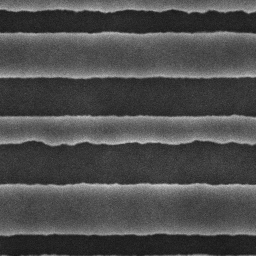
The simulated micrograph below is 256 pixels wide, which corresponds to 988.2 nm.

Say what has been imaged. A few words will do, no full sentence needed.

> lines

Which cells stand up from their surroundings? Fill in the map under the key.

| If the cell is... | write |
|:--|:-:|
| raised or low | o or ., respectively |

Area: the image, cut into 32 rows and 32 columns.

oooooooooooooooooooooooooooooooo
.............o.........ooo.....o
................................
................................
oooooooooooooooooooooooooooooooo
oooooooooooooooooooooooooooooooo
oooooooooooooooooooooooooooooooo
oooooooooooooooooooooooooooooooo
oooooooooooooooooooooooooooooooo
oooooooooooooooooooooooooooooooo
................................
................................
................................
................................
.................o...........o..
oooooooooooooooooooooooooooooooo
oooooooooooooooooooooooooooooooo
oooooooooooooooooooooooooooooooo
................................
................................
................................
................................
................................
oooooooooooooooooooooooooooooooo
oooooooooooooooooooooooooooooooo
oooooooooooooooooooooooooooooooo
oooooooooooooooooooooooooooooooo
oooooooooooooooooooooooooooooooo
oooooooooooooooooooooooooooooooo
................................
................................
................................